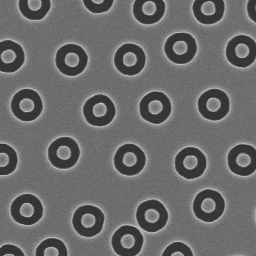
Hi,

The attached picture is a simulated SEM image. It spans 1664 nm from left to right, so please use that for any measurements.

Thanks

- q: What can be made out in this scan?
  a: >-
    a regular array of ring-shaped grooves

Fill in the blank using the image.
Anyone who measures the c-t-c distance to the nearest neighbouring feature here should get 0.366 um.